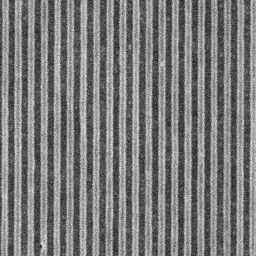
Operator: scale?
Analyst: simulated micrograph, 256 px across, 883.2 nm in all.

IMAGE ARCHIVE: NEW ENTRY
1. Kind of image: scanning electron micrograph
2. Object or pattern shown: parallel lines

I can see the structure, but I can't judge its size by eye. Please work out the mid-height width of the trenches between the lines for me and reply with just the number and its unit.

25.9 nanometers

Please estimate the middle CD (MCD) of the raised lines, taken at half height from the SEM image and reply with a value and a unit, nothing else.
19.4 nm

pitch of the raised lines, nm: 45.1